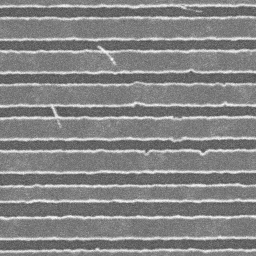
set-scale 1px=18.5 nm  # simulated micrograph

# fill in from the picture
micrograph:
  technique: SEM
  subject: parallel lines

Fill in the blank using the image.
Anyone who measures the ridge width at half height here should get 398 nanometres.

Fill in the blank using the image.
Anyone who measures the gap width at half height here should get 218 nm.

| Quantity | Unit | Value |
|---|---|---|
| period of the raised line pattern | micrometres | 0.616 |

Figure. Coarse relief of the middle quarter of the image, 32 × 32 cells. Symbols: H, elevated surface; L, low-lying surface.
HHHHHHHHHHHHHHHHHHHHHHHHHHHHHHHH
HHHHHHHHHHHHHHHHHHHHHHHHHHHHHHHH
LLLLLLLLLLLLLLLLLLLLLLLLLLLLLLLL
LLLLLLLLLLLLLLLLLLLLLLLLLLLLLLLL
LLLLLLLLLLLLLLLLLLLLLLLLLLLLLLLL
HHHHHHHHHHHHHHHHHHHHHHHHHHHHHHHH
HHHHHHHHHHHHHHHHHHHHHHHHHHHHHHHH
HHHHHHHHHHHHHHHHHHHHHHHHHHHHHHHH
HHHHHHHHHHHHHHHHHHHHHHHHHHHHHHHH
HHHHHHHHHHHHHHHHHHHHHHHHHHHHHHHH
HLLLHHHLHLLHLHHLLLLLLLLLLHLLLHLH
LLLLLLLLLLLLLLLLLLLLLLLLLLLLLLLL
LLLLLLLLLLLLLLLLLLLLLLLLLLLLLLLL
LHHLHHLLLLHHHLHHLHHLHHLLHHHLLLHH
HHHHHHHHHHHHHHHHHHHHHHHHHHHHHHHH
HHHHHHHHHHHHHHHHHHHHHHHHHHHHHHHH
HHHHHHHHHHHHHHHHHHHHHHHHHHHHHHHH
HHHHHHHHHHHHHHHHHHHHHHHHHHHHHHHH
HHHHHHHHHHHHHHHHHHHHHHHHHHHHHHHH
LLLLLLLLLLLLLLLLLLLLLLLLLLLLLLLL
LLLLLLLLLLLLLLLLLLLLLLLLLLLLLLLL
LLLLLLLLLHLLLLLLLLLLLLLLLLLLLLLL
HHHHHHHHHHHHHHHHHHHHHHHHHHHHHHHH
HHHHHHHHHHHHHHHHHHHHHHHHHHHHHHHH
HHHHHHHHHHHHHHHHHHHHHHHHHHHHHHHH
HHHHHHHHHHHHHHHHHHHHHHHHHHHHHHHH
HHHHHHHHHHHHHHHHHHHHHHHHHHHHHHHH
LLLLLLLLLLLLLLLLLLLLLLLLLLLLLLLL
LLLLLLLLLLLLLLLLLLLLLLLLLLLLLLLL
LLLLLLLLLLLLLLLLLLLLLLLLLLLLLLLL
HHHHHHLLHHHHHHHHHHLLHLHHHHHHHHHH
HHHHHHHHHHHHHHHHHHHHHHHHHHHHHHHH